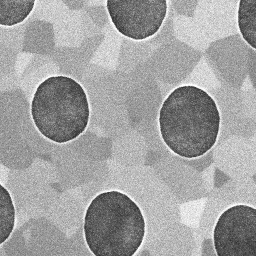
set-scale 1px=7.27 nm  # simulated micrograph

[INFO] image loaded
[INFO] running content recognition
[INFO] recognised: holes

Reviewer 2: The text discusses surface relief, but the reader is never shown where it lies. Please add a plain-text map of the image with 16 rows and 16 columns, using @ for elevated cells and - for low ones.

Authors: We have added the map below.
--@@@@@---@@@@@-
-@@@@@@---@@@@@-
@@@@@@@@@@@@@@@-
@@@@@@@@@@@@@@@@
@@@@@@@@@@@@@@@@
@@---@@@@@@-@@@@
@@----@@@@---@@@
@@----@@@@----@@
@@@--@@@@@----@@
@@@@@@@@@@@--@@@
@@@@@@@@@@@@@@@@
@@@@@@@@@@@@@@@@
-@@@@@--@@@@@@@@
-@@@@----@@@@@--
-@@@@----@@@@---
@@@@@@---@@@@---